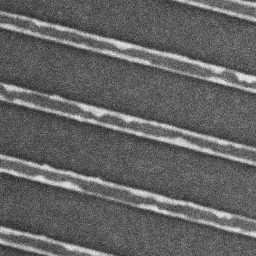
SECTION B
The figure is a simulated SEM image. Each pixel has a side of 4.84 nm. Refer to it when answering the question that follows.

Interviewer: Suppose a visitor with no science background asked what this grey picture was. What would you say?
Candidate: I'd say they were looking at one or a few lines or trenches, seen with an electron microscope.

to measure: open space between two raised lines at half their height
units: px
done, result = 53.6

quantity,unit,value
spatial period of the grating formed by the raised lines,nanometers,338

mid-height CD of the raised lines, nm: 76.1